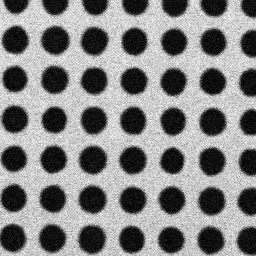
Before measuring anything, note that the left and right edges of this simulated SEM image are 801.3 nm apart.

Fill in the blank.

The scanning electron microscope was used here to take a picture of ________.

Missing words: a regular array of holes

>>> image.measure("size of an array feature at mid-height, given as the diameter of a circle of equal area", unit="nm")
84.2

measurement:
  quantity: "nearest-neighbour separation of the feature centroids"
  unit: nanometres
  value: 123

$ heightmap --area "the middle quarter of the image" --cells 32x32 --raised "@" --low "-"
@@@@@@@@@@@@@@@@@@@@@@@@@@@@@@@@
@@@@@@----@@@@@@---@@@@@@@---@@@
-@@@@------@@@------@@@@@-----@@
-@@@-------@@@-------@@@-------@
-@@@-------@@@-------@@@-------@
-@@@-------@@@-------@@@------@@
@@@@@-----@@@@@-----@@@@@-----@@
@@@@@@@--@@@@@@@---@@@@@@@---@@@
@@@@@@@@@@@@@@@@@@@@@@@@@@@@@@@@
@@@@@@@@@@@@@@@@@@@@@@@@@@@@@@@@
@@@@@@@@@@@@@@@@@@@@@@@@@@@@@@@@
@@@@@-----@@@@@----@@@@@@----@@@
@@@@@-----@@@@------@@@@@-----@@
-@@@-------@@@------@@@@-------@
-@@@-------@@@------@@@@------@@
@@@@@-----@@@@------@@@@------@@
@@@@@-----@@@@@-----@@@@@-----@@
@@@@@@@-@@@@@@@@---@@@@@@@---@@@
@@@@@@@@@@@@@@@@@@@@@@@@@@@@@@@@
@@@@@@@@@@@@@@@@@@@@@@@@@@@@@@@@
@@@@@@@@@@@@@@@@@@@@@@@@@@@@@@@@
@@@@@-----@@@@@-----@@@@@----@@@
@@@@-------@@@------@@@@------@@
-@@@-------@@@-------@@@------@@
-@@@-------@@@-------@@@------@@
@@@@------@@@@------@@@@------@@
@@@@@-----@@@@@-----@@@@@----@@@
@@@@@@--@@@@@@@@--@@@@@@@@@-@@@@
@@@@@@@@@@@@@@@@@@@@@@@@@@@@@@@@
@@@@@@@@@@@@@@@@@@@@@@@@@@@@@@@@
@@@@@@--@@@@@@@@@@@@@@@@@@@@@@@@
@@@@@-----@@@@@----@@@@@@----@@@